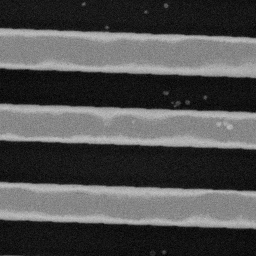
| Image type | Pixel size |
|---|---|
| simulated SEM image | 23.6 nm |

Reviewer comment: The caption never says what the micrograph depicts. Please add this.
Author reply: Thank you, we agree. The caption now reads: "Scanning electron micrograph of lines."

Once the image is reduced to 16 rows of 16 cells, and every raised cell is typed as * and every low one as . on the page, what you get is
................
................
****************
****************
........********
................
................
****************
****************
................
................
*...............
****************
****************
................
................